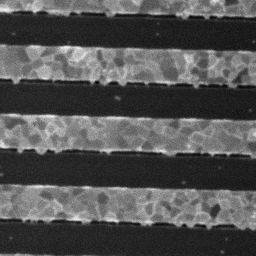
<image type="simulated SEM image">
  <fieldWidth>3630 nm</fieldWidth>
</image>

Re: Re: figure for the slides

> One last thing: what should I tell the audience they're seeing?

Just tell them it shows lines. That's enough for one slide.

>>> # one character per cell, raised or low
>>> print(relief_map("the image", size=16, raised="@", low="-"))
@@@@@@@@@@@@@@@@
----------------
----------------
@@@@@@@@@@@@@@@@
@@@@@@@@@@@@@@@@
----------------
----------------
@@@@@@@@@@@@----
@@@@@@@@@@@@@@@@
----------@@@@@@
----------------
----------------
@@@@@@@@@@@@@@@@
@@@@@@@@@@@@@@@@
----------------
----------------